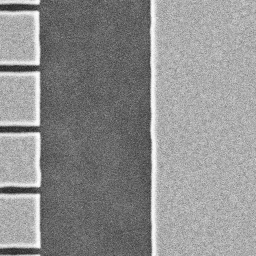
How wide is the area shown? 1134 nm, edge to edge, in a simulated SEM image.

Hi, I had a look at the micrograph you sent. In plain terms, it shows wiring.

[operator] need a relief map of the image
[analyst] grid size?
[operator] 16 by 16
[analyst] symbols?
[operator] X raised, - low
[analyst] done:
----------XXXXXX
XX-------XXXXXXX
XX-------XXXXXXX
XX--------XXXXXX
XX--------XXXXXX
XX--------XXXXXX
XX--------XXXXXX
XX--------XXXXXX
XX--------XXXXXX
XX--------XXXXXX
XX--------XXXXXX
XX--------XXXXXX
XX--------XXXXXX
XX--------XXXXXX
XX--------XXXXXX
----------XXXXXX